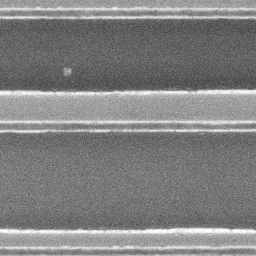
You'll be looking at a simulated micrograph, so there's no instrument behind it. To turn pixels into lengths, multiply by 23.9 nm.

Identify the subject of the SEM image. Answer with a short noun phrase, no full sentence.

lines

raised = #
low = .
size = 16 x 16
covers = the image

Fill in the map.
################
................
................
................
................
................
################
################
................
................
................
................
................
................
................
################